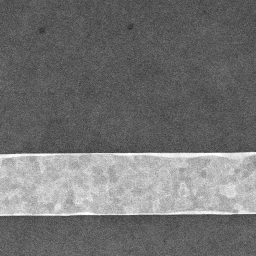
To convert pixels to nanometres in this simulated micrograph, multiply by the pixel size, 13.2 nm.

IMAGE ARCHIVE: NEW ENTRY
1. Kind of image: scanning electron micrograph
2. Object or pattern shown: wiring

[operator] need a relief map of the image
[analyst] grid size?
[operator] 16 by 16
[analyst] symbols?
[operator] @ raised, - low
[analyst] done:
----------------
----------------
----------------
----------------
----------------
----------------
----------------
----------------
----------------
----------------
@@@@@@@@@@@@@@@@
@@@@@@@@@@@@@@@@
@@@@@@@@@@@@@@@@
----------------
----------------
----------------